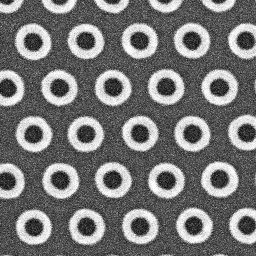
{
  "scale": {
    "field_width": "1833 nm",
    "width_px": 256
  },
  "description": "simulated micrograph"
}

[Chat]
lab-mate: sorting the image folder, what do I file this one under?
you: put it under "a regular array of ring-shaped raised bodies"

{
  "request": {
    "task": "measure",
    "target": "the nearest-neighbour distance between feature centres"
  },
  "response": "375 nanometers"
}